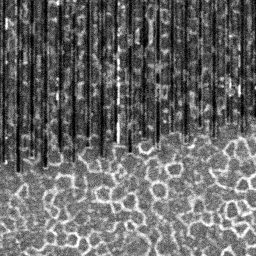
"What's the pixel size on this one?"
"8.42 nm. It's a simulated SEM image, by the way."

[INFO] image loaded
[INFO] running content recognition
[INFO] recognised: parallel lines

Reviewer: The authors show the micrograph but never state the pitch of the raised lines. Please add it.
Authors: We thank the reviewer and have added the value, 118 nm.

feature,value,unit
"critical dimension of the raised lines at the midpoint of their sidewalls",4.88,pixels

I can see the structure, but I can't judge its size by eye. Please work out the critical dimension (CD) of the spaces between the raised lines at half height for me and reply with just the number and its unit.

74.7 nm